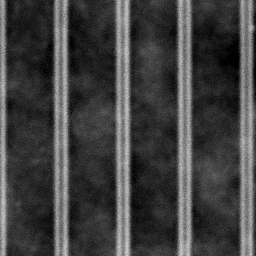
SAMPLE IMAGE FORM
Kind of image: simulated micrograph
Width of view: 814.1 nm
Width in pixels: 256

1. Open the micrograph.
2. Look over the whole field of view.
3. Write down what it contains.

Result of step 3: parallel lines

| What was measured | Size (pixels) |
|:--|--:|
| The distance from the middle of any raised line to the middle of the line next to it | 61.9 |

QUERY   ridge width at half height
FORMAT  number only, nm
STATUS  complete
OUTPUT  29.8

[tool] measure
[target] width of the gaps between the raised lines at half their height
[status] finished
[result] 166 nm